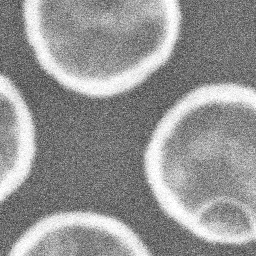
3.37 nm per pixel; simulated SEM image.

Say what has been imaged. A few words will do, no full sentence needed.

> raised bodies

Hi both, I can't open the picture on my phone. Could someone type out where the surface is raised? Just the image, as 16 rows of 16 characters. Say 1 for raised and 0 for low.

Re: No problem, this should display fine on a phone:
0011111111100000
0011111111100000
0011111111100000
0001111111000000
0001111110000000
1000000000000000
1000000000001111
1100000000011111
1100000000111111
1100000000111111
1100000000111111
1000000000111111
0000000000111111
0000000000011111
0011111100000111
0111111110000000